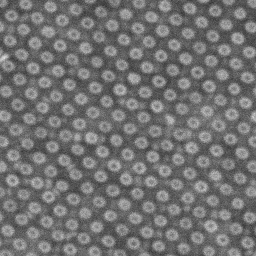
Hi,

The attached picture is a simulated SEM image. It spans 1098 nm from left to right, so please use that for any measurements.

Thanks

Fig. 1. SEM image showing a regular array of raised bodies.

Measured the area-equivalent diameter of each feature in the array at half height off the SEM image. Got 42.7 nanometers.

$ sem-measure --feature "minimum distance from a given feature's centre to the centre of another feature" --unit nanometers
74.9